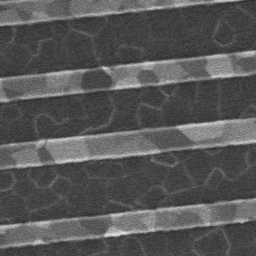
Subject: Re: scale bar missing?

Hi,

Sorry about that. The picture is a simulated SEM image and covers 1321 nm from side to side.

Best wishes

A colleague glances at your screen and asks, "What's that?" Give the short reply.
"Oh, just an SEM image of one or a few lines or trenches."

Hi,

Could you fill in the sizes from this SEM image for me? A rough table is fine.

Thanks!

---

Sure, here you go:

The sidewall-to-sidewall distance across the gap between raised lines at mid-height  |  282 nanometers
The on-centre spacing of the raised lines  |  378 nm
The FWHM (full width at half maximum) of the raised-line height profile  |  108 nanometers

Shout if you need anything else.